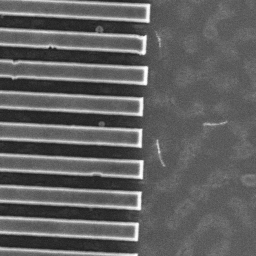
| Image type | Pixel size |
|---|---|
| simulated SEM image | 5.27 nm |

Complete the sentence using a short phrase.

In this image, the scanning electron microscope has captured parallel lines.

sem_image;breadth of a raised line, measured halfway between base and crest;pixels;17.1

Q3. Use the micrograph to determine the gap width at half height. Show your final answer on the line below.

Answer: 0.0757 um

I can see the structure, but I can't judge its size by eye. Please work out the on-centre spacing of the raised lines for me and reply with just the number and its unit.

165 nanometres